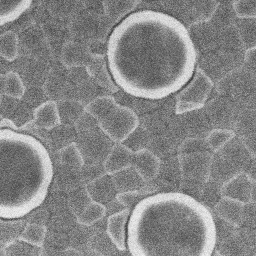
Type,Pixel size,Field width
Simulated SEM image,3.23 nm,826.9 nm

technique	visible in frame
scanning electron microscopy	raised bodies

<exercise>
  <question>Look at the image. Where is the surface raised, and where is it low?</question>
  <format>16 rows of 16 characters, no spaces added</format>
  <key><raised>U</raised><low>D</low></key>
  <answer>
UDDDDDDDDDDDDDDD
DDDDDDDDUUUDDDDD
DDDDDDDUUUUUDDDD
DDDDDDDUUUUUDDDD
DDDDDDDUUUUUDDDD
DDDDDDDDUUUDDDDD
DDDDDDDDDDDDDDDD
DDDDDDDDDDDDDDDD
UDDDDDDDDDDDDDDD
UUUDDDDDDDDDDDDD
UUUDDDDDDDDDDDDD
UUUDDDDDDDDDDDDD
UUDDDDDDDUUUDDDD
DDDDDDDDUUUUUDDD
DDDDDDDDUUUUUDDD
DDDDDDDDUUUUUDDD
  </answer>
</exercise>